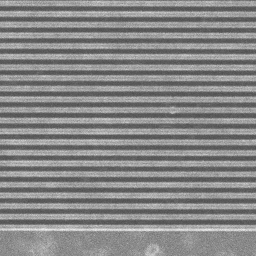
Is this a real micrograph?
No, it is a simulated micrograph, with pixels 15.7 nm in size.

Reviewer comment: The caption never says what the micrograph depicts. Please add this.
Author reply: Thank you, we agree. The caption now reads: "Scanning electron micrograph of parallel lines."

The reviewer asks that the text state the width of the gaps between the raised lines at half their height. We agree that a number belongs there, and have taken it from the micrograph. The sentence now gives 0.0923 micrometres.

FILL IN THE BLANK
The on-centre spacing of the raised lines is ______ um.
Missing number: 0.167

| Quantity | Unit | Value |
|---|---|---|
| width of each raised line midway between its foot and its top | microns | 0.0805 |